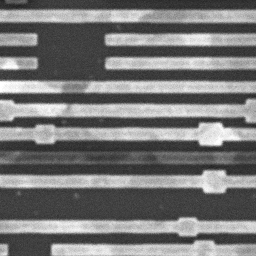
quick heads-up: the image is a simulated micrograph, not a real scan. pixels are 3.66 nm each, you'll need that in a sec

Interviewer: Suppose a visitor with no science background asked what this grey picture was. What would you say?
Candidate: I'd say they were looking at wiring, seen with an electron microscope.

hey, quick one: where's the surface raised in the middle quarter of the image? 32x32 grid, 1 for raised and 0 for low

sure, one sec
00000000000111111111111111111111
00000000000000000000000000000000
00000000000000000000000000000000
00000000000000000000000000000000
00000000000000000000000000000000
11111111111111111111111111111111
11111111111111111111111111111111
00000000000000000000000000000000
00000000000000000000000000000000
00000000000000000000000000000000
11111111111111111111111111111111
11111111111111111111111111111111
11111111111111111111111111111111
00000000000000000000000000000000
00000000000000000000000000000000
00000000000000000000000000000000
11111111111111111111111111111111
11111111111111111111111111111111
11111111111111111111111111111111
00000000000000000000000000000000
00000000000000000000000000000000
00000000000000000000000000000000
11111111111111111111111111111111
11111111111111111111111111111111
11111111111111111111111111111111
00000000000000000000000000000000
00000000000000000000000000000000
00000000000000000000000000000000
11111111111111111111111111111111
11111111111111111111111111111111
11111111111111111111111111111111
00000000000000000000000000000000